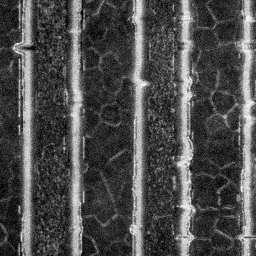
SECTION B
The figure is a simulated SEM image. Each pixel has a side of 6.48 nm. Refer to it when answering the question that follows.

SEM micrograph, one or a few lines or trenches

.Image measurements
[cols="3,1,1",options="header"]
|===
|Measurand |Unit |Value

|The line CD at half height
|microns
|0.404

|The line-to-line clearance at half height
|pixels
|47.6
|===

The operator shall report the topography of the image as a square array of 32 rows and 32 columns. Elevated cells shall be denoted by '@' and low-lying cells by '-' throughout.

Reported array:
@@@@------@@@@@@@------@@@@@@@@-
@@@------@@@@@@@@------@@@@@@@@-
@@@-------@@@@@@@------@@@@@@@@-
@@@------@@@@@@@@------@@@@@@@@-
@@@-------@@@@@@@------@@@@@@@@-
@@@-------@@@@@@@------@@@@@@@@-
@@@-------@@@@@@@------@@@@@@@@-
@@@------@@@@@@@@------@@@@@@@@-
@@@------@@@@@@@@------@@@@@@@@-
@@@-------@@@@@@@------@@@@@@@@-
@@@-------@@@@@@@@-----@@@@@@@@-
@@@-------@@@@@@@------@@@@@@@@-
@@@-------@@@@@@@------@@@@@@@@-
@@@------@@@@@@@@------@@@@@@@@-
@@@------@@@@@@@@------@@@@@@@@-
@@@------@@@@@@@@------@@@@@@@@-
@@@------@@@@@@@@------@@@@@@@@-
@@@------@@@@@@@@------@@@@@@@@-
@@@------@@@@@@@@------@@@@@@@@-
@@@------@@@@@@@@------@@@@@@@@-
@@@------@@@@@@@@------@@@@@@@@-
@@@-------@@@@@@@------@@@@@@@@-
@@@-------@@@@@@@------@@@@@@@@-
@@@------@@@@@@@@------@@@@@@@@-
@@@------@@@@@@@@------@@@@@@@@-
@@@------@@@@@@@@------@@@@@@@@-
@@@------@@@@@@@@------@@@@@@@@-
@@@------@@@@@@@@------@@@@@@@@-
@@@-------@@@@@@@------@@@@@@@@-
@@@------@@@@@@@@------@@@@@@@@-
@@@------@@@@@@@@------@@@@@@@@-
@@@------@@@@@@@@------@@@@@@@@-